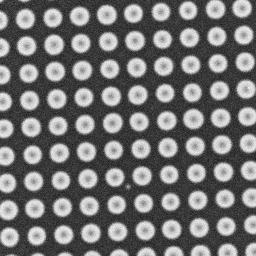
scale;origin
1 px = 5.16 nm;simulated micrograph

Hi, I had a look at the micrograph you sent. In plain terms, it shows an array of small figures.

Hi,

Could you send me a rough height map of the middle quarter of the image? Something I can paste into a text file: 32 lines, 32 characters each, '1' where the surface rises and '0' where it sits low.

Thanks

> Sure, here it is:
00011110011111001111000111100011
00111110011111001111000111100011
00111110001110000111000011000000
00011100000000000000000000000000
00000000000000000000000000000000
00000000000000000010000011000001
00001100001110000111000111100011
00011110001111001111100111100011
00011110001111001111100011100011
00011110001111000111000000000000
00000000000000000000000000000000
00000000000000000000000000000000
00000000000010000010000011100011
00001110001111000111100011110011
10011110001111000111100111110011
10011110001111000111100011110001
00001110000111000011000000000000
00000000000000000000000000000000
00000000000000000000000000000000
00000000000010000011100011110001
00001110000111000111100011110001
10001111001111100111100011110001
10001111000111000111100011110000
10001110000110000000000000000000
00000000000000000000000000000000
00000000000000000000000000000000
00000100000011000011100001110001
10001111000111100111110011110001
10001111000111100111110011110001
10001111000111100011100001100000
10000110000000000000000000000000
00000000000000000000000000000000